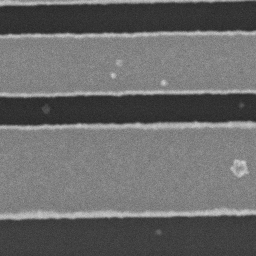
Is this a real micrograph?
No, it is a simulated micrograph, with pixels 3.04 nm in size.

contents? lines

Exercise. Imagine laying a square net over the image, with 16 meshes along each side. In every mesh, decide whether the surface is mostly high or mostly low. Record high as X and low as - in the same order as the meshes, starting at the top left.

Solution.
----------------
----------------
XXXXXXXXXXXXXXXX
XXXXXXXXXXXXXXXX
XXXXXXXXXXXXXXXX
XXXXXXXXXXXXXXXX
----------------
----------------
XXXXXXXXXXXXXXXX
XXXXXXXXXXXXXXXX
XXXXXXXXXXXXXXXX
XXXXXXXXXXXXXXXX
XXXXXXXXXXXXXXXX
XXXXXXXXXXX-----
----------------
----------------